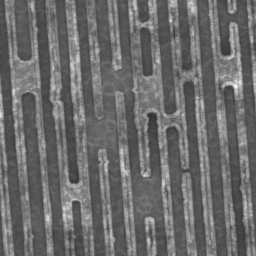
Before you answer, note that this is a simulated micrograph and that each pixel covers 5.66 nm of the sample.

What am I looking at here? parallel lines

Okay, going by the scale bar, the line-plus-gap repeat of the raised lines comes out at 114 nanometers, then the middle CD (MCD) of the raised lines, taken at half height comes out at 47.9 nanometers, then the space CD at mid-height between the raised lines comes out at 67.6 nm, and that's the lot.